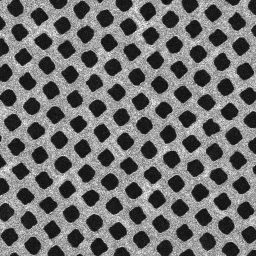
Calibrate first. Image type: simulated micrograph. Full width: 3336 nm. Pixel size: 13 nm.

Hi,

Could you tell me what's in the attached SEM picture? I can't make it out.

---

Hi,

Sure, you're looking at a regular array of holes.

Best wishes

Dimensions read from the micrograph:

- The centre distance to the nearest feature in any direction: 320 nm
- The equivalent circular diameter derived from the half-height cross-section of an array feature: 0.212 um